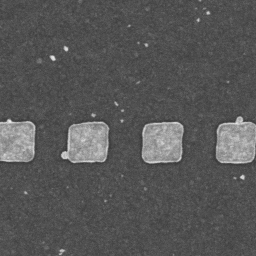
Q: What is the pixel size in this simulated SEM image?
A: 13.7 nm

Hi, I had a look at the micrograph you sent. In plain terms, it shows raised bodies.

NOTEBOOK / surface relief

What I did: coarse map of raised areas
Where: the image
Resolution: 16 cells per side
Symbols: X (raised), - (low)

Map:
----------------
----------------
----------------
----------------
----------------
----------------
----------------
----------------
XX--XXX--XX---XX
XX--XXX--XX---XX
----------------
----------------
----------------
----------------
----------------
----------------